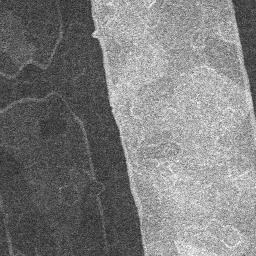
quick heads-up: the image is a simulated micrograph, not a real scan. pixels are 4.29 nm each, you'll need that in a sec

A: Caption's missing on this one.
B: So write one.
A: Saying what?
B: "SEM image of one or a few lines or trenches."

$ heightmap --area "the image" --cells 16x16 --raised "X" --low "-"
XXXX--XXXXXXXX--
XXXX--XXXXXXXXX-
XXXX--XXXXXXXXX-
XXX----XXXXXXXX-
X------XXXXXXXX-
-------XXXXXXXX-
-XXX---XXXXXXXXX
XXXXX--XXXXXXXXX
XXXXX---XXXXXXXX
XXXXXX--XXXXXXXX
XXXXXX--XXXXXXXX
XXXXXX--XXXXXXXX
XXXXXX---XXXXXXX
XXXXXX---XXXXXXX
XXXXXXX--XXXXXXX
-XXXXXX--XXXXXXX